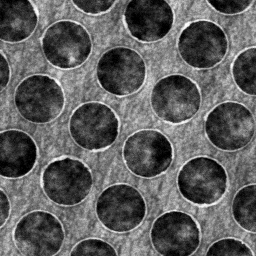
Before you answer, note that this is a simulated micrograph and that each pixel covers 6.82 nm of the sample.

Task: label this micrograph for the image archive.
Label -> a regular array of holes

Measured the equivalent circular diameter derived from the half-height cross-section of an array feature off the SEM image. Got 331 nm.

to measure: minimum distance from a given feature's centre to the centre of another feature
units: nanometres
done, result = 413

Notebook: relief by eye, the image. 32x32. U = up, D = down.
DDDDUUUUUDDDDDUUDDDDDUUUUUDDDDDU
DDDDUUUUUUUDDUUUDDDDDDUUUUUDDDUU
DDDDDUUUUUUUUUUUDDDDDDUUUUUUUUUU
DDDDUUDDDDUUUUUUDDDDDUUDDDDDUUUU
DDDDUUDDDDDUUUUUUDDDDUUDDDDDUUUU
UUUUUDDDDDDUUUUUUUUUUUDDDDDDUUUU
UUUUUDDDDDDUUDDDDUUUUUDDDDDDUUDD
DUUUUUDDDDDUDDDDDDUUUUUDDDDDUDDD
DUUUUUUUDUUUDDDDDDUUUUUUUDUUUDDD
DUUUDDUUUUUUDDDDDDUUUDDUUUUUUDDD
DUUDDDDUUUUUUDDDDDUDDDDDUUUUUUDD
UUDDDDDDUUUUUUDDDUUDDDDDDUUUUUUD
UUDDDDDDUUUUUUUUUUUDDDDDDUUUUUUU
UUDDDDDDUUDDDDUUUUUDDDDDDUUDDDDU
UUUDDDDUUDDDDDUUUUUUDDDDUUDDDDDD
UUUUUUUUUDDDDDDUUUUUUUUUUUDDDDDD
DDDUUUUUUDDDDDDUUDDDUUUUUUDDDDDD
DDDDUUUUUDDDDDUUDDDDDUUUUUDDDDDU
DDDDDUUUUUDDDUUDDDDDDUUUUUUDDDUU
DDDDDUUUUUUUUUUDDDDDDDUUUUUUUUUU
DDDDUUDDDDUUUUUUDDDDDUUDDDDUUUUU
DDDDUUDDDDDUUUUUUDDDUUDDDDDDUUUU
UUUUUDDDDDDDUUUUUUUUUUDDDDDDUUUU
UUUUUDDDDDDUUDDDDUUUUUDDDDDDUUDD
DUUUUUDDDDDUDDDDDDUUUUUDDDDDUDDD
DUUUUUUDDUUUDDDDDDUUUUUUUDUUUDDD
DUUUDDUUUUUUDDDDDDUUUDDUUUUUUDDD
DUUDDDDUUUUUDDDDDDUUDDDDUUUUUDDD
UUDDDDDDUUUUUDDDDUUDDDDDDUUUUUDD
UUDDDDDDUUUUUUUUUUUDDDDDDUUUUUUU
UUDDDDDDUUDDDDUUUUUDDDDDDUUDDDDU
UUUDDDDUUDDDDDUUUUUUDDDDUUDDDDDD